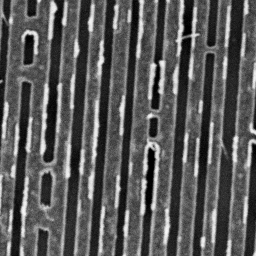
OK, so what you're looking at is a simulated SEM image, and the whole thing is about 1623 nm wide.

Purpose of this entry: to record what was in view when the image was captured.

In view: parallel lines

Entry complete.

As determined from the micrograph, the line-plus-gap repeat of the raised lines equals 164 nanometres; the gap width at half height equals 0.0656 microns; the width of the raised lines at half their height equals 98.8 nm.